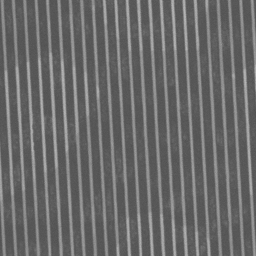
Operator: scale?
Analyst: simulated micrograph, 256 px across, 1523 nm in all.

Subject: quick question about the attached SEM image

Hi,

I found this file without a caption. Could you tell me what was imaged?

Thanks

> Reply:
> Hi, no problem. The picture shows parallel lines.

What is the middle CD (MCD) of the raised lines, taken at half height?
12.6 nm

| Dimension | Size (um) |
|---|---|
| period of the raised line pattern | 0.0675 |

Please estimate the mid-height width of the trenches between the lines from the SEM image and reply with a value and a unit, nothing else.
0.0549 µm